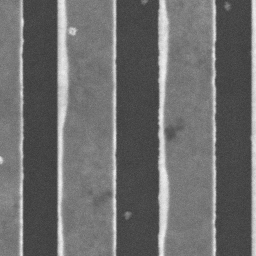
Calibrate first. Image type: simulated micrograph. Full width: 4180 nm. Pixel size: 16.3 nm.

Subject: lines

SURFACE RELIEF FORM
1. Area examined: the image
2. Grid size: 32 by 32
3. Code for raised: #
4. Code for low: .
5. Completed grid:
###....#######......#######.....
###.....######......#######.....
###.....######......#######.....
###.....######......#######.....
###.....######......#######.....
###.....######......#######.....
###.....######......#######.....
###.....######......#######.....
###.....######......#######.....
###.....######......#######.....
###.....######......#######.....
###.....######......#######.....
###.....######......#######.....
###.....######......#######.....
###.....######......#######.....
###....#######......#######.....
###....#######......#######.....
###....#######......#######.....
###....#######......#######.....
###....#######......#######.....
###....#######......#######.....
###....#######......#######.....
###....#######......#######.....
###....#######......#######.....
###....#######......#######.....
###....#######......#######.....
###....#######......#######.....
###....#######......#######.....
###....#######......#######.....
###....#######......#######.....
###....#######......#######.....
###....#######......#######.....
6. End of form